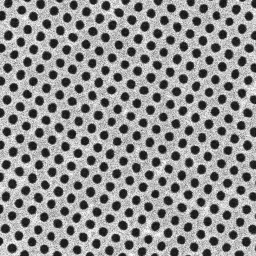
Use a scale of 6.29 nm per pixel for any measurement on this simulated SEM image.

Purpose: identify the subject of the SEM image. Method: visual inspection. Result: a regular array of holes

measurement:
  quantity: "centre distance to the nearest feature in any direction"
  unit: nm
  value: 88.6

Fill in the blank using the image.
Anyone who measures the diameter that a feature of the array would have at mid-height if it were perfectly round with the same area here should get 57.4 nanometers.